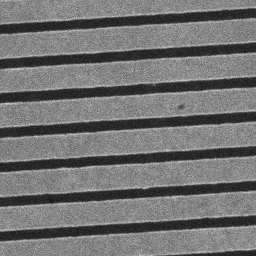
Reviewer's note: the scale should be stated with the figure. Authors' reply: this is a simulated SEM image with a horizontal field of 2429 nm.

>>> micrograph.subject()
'parallel lines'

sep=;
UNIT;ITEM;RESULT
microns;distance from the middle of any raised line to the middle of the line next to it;0.327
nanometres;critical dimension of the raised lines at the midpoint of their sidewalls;223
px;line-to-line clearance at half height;10.7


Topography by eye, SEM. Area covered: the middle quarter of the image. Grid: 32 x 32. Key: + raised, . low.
++++++++++++++++++++++++++++++++
++++++++++++++++++++++++++++++++
++++++++++++++++++++++++++++++++
++++++++++++++++++++++++++++++++
++++++++++++++++++++++++........
+++++++++.+.....................
................................
.......................+++++++++
........++++++++++++++++++++++++
++++++++++++++++++++++++++++++++
++++++++++++++++++++++++++++++++
++++++++++++++++++++++++++++++++
++++++++++++++++++++++++++++++++
++++++++++++++++++..............
+++.............................
................................
..................++++++++++++++
...+++++++++++++++++++++++++++++
++++++++++++++++++++++++++++++++
++++++++++++++++++++++++++++++++
++++++++++++++++++++++++++++++++
+++++++++++++++++++++++++++++++.
+++++++++++++++.................
................................
...........................+++++
............++++++++++++++++++++
++++++++++++++++++++++++++++++++
++++++++++++++++++++++++++++++++
++++++++++++++++++++++++++++++++
++++++++++++++++++++++++++++++++
++++++++++++++++++++++++........
++++++++++......................